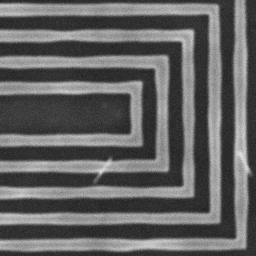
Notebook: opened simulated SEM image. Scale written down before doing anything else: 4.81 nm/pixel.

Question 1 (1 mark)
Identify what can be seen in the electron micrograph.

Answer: groups of lines, slits or small figures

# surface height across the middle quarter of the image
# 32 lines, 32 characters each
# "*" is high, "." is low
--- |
.....*********************....**
.......................***....**
.......................***....**
.......................***....**
.......................***....**
*******************....***....**
*******************....***....**
.................**....***....**
.................**....***....**
.................**.....**....**
.................**.....**....**
.................**....***....**
.................**....***....**
.................**....***....**
.................**....***....**
.................**....***....**
.................**....***....**
.................**....***....**
*******************....***....**
*******************....***....**
.......................***....**
.......................***....**
.......................***....**
.......................***....**
*********..*.*************....**
**************************....**
**************************....**
..............................**
..............................**
..............................**
..............................**
********************************